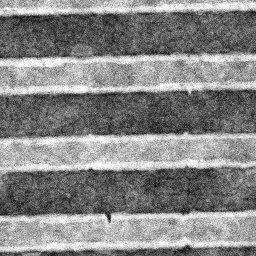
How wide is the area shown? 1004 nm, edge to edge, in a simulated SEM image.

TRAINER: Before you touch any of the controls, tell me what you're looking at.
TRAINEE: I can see one or a few lines or trenches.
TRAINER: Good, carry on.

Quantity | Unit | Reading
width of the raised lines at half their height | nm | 112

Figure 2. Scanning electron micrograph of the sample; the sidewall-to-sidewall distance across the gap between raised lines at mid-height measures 198 nanometres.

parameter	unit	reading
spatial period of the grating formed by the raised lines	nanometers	309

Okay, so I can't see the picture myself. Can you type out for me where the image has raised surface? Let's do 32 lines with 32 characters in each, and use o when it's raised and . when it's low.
oooooooooooooooooooooooooooooooo
ooo.............................
................................
................................
................................
................................
................................
................oooooooooooooooo
oooooooooooooooooooooooooooooooo
oooooooooooooooooooooooooooooooo
oooooooooooooooooooooooooooooooo
................................
................................
................................
................................
................................
................................
..........oooooooooooooooooooooo
oooooooooooooooooooooooooooooooo
oooooooooooooooooooooooooooooooo
oooooooooooooooooooooooooooo.ooo
................................
................................
................................
................................
................................
................................
ooooooooooooo.oooooooooooooooooo
oooooooooooooooooooooooooooooooo
oooooooooooooooooooooooooooooooo
ooooooooooooooooooooooo.ooo.....
................................